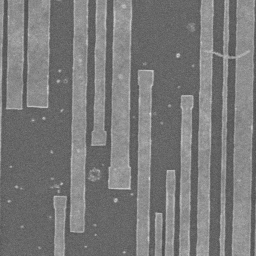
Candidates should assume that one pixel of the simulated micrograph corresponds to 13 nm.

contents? groups of lines, slits or small figures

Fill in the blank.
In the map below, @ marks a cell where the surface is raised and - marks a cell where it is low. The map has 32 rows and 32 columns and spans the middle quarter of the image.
--@@@@--@@--@@@@@---------------
--@@@@--@@--@@@@@---------------
--@@@@--@@--@@@@---@@@----------
--@@@@--@@--@@@@---@@@----------
--@@@@--@@--@@@@---@@@----------
--@@@@--@@--@@@@---@@@----------
--@@@@--@@--@@@@---@@@----------
--@@@---@@--@@@@---@@@----------
--@@@---@@--@@@@---@@@-------@@@
--@@@@--@@--@@@@---@@@-------@@@
--@@@---@@--@@@@---@@@-------@@@
--@@@---@@--@@@@---@@@--------@@
--@@@---@@--@@@@---@@@--------@@
--@@@---@@--@@@@---@@@--------@@
--@@@@--@@--@@@@---@@@-------@@@
--@@@@--@@--@@@@---@@@-------@@@
--@@@--@@@--@@@@---@@@-------@@@
--@@@--@@@--@@@@---@@@-------@@@
--@@@--@@@--@@@@---@@@-------@@@
--@@@--@@@--@@@@---@@@-------@@@
--@@@-------@@@@---@@@-------@@@
--@@@-------@@@@---@@@-------@@@
--@@@-------@@@@---@@@-------@@@
--@@@-------@@@@---@@@-------@@@
--@@@-------@@@@---@@--------@@@
--@@@-------@@@@---@@--------@@@
--@@@------@@@@@@--@@--------@@-
--@@@------@@@@@@--@@-----@@-@@-
--@@@------@@@@@@--@@-----@@-@@-
--@@@------@@@@@---@@-----@@-@@-
--@@@------@@@@@--@@@-----@@-@@-
--@@@-------------@@@-----@@-@@-